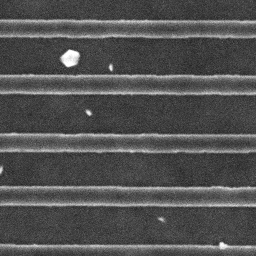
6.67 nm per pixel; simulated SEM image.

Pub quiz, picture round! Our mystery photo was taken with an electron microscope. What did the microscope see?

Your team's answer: lines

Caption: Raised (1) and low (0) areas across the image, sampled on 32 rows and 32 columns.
00000000000000000000000000000000
00000000000000000000000000000000
00000000000000000000000000000000
11111111111111111111111111111111
11111111111111111111111111111111
00000000000000000000000000000000
00000000100000000000000000000000
00000000110000000000000000000000
00000000000000000000000000000000
11111111111111111111011110111100
11111111111111111111111111111111
11111111111111111111111111111111
00000000000000000000000000000000
00000000000000000000000000000000
00000000000000000000000000000000
00000000000000000000000000000000
00000000000000000000000000000000
11111111111111111111111111111111
11111111111111111111111111111111
00000000000000000000000000000000
00000000000000000000000000000000
00000000000000000000000000000000
00000000000000000000000000000000
11111111111111111111111111111111
11111111111111111111111111111111
11111111111111111111111111111111
00000000000000000000000000000000
00000000000000000000000000000000
00000000000000000000000000000000
00000000000000000000000000000000
00000000000000000000000000000000
11111111111111111111111111111111